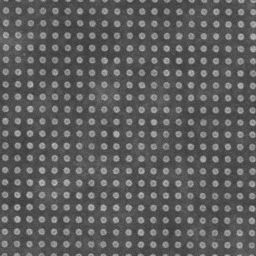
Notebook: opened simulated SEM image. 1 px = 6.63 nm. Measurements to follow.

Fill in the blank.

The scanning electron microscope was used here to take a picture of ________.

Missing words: a regular array of raised bodies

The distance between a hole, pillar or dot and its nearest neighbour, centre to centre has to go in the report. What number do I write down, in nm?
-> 80.2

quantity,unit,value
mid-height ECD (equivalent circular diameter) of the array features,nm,39.6